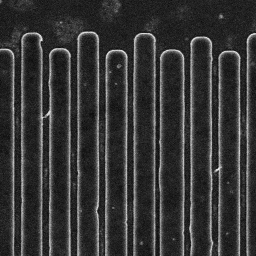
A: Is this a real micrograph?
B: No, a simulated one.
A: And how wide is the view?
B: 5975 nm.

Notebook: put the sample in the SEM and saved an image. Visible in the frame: parallel lines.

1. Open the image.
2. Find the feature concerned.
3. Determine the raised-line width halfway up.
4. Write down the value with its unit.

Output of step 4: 20.5 px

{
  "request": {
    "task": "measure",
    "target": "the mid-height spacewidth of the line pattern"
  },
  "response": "178 nanometers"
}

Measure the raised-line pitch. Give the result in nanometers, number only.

658